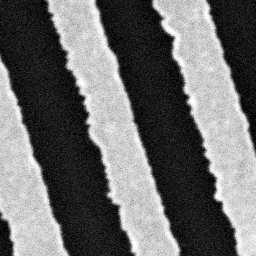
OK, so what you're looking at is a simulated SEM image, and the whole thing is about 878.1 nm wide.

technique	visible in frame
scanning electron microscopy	lines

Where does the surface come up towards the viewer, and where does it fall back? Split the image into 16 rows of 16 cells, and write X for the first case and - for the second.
---XXX----XXX---
---XXX----XXX---
----XXX----XXX--
----XXX----XXX--
-----XX----XXX--
X----XXX----XXX-
X----XXX----XXX-
X-----XX----XXX-
XX----XXX----XXX
XX----XXX----XXX
XX-----XX----XXX
XXX----XXX----XX
XXX----XXX----XX
XXX-----XX----XX
-XXX----XXX----X
-XXX----XXX----X